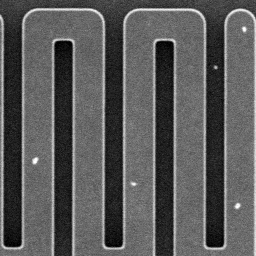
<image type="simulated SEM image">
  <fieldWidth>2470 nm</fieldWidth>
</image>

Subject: groups of lines, slits or small figures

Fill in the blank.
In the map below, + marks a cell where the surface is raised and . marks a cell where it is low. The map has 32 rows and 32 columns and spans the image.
................................
....++++++++....+++++++++....++.
...++++++++++...++++++++++..++++
...++++++++++...++++++++++..++++
...++++++++++...++++++++++..++++
...++++..++++...+++...++++..++++
...++++..++++...+++...++++..++++
...++++..++++...+++...++++..++++
...++++..++++..++++...++++..++++
...++++..++++..++++...++++..++++
...++++..++++..++++...++++..++++
...++++..++++..++++...++++..++++
...++++..++++..++++...++++..++++
...++++..++++..++++...++++..++++
...++++..++++..++++...++++..++++
...++++..++++..++++...++++..++++
...++++..++++..++++...++++..++++
...++++..++++..++++...++++..++++
...++++..++++..++++...++++..++++
...++++..++++..++++...++++..++++
...++++..++++..++++...++++..++++
...++++..++++..++++...++++..++++
...++++..++++..++++...++++..++++
...++++..++++..++++...++++..++++
...++++..++++..++++...++++..++++
...++++..++++..++++...++++..++++
...++++..++++..++++...++++..++++
...++++..++++..++++...++++..++++
...++++..++++..++++...++++..++++
...++++..++++..++++...++++..++++
...++++..++++..++++...++++..++++
+++++++..++++++++++...++++++++++